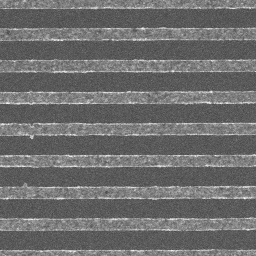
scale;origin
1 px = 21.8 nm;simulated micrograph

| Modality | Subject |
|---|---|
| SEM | parallel lines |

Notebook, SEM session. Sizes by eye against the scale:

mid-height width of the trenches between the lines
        0.435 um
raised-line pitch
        690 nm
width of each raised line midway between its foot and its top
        253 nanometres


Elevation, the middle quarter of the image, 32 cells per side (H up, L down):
HHHHHHHHHHHHHHHHHHHHHHHHHHHHHHHH
HHHHHHHHHHHHHHHHHHHHHHHHHHHHHHHH
LLLLLLLLLLLLLLLLLLLLLLLLLLLLLLLL
LLLLLLLLLLLLLLLLLLLLLLLLLLLLLLLL
LLLLLLLLLLLLLLLLLLLLLLLLLLLLLLLL
LLLLLLLLLLLLLLLLLLLLLLLLLLLLLLLL
LLLLLLLLLLLLLLLLLLLLLLLLLLLLLLLL
HHHHHHHHHHHHHHHHHHHHHHHHHHHHHHHH
HHHHHHHHHHHHHHHHHHHHHHHHHHHHHHHH
HHHHHHHHHHHHHHHHHHHHHHHHHHHHHHHH
LLLLLLLLLLLLLLLLLLLLLLLLLLLLLLLL
LLLLLLLLLLLLLLLLLLLLLLLLLLLLLLLL
LLLLLLLLLLLLLLLLLLLLLLLLLLLLLLLL
LLLLLLLLLLLLLLLLLLLLLLLLLLLLLLLL
LLLLLLLLLLLLLLLLLLLLLLLLLLLLLLLL
HHHHHHHHHHHHHHHHHHHHHHHHHHHHHHHH
HHHHHHHHHHHHHHHHHHHHHHHHHHHHHHHH
HHHHHHHHHHHHHHHHHHHHHHHHHHHHHHHH
LLLLLLLLLLLLLLLLLLLLLLLLLLLLLLLL
LLLLLLLLLLLLLLLLLLLLLLLLLLLLLLLL
LLLLLLLLLLLLLLLLLLLLLLLLLLLLLLLL
LLLLLLLLLLLLLLLLLLLLLLLLLLLLLLLL
LLLLLLLLLLLLLLLLLLLLLLLLLLLLLLLL
HHHHHHHHHHHHHHHHHHHHHHHHHHHHHHHH
HHHHHHHHHHHHHHHHHHHHHHHHHHHHHHHH
HHHHHHHHHHHHHHHHHHHHHHHHHHHHHHHH
LLLLLLLLLLLLLLLLLLLLLLLLLLLLLLLL
LLLLLLLLLLLLLLLLLLLLLLLLLLLLLLLL
LLLLLLLLLLLLLLLLLLLLLLLLLLLLLLLL
LLLLLLLLLLLLLLLLLLLLLLLLLLLLLLLL
LLLLLLLLLLLLLLLLLLLLLLLLLLLLLLLL
HHHHHHHHHHHHHHHHHHHHHHHHHHHHHHHH